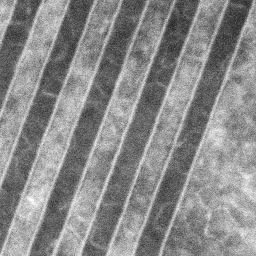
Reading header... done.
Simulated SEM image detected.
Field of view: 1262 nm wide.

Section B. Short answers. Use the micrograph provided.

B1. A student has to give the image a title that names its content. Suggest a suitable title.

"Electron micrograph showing parallel lines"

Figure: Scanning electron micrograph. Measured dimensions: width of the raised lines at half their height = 128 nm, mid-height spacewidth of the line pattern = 23.3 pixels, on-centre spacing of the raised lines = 244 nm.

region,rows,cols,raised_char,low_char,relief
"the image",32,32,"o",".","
..ooo...oooo...ooo....ooo...oooo
.oooo...ooo....ooo...oooo...ooo.
.ooo....ooo...oooo...ooo....ooo.
.ooo...oooo...ooo...oooo...oooo.
oooo...ooo...oooo...oooo...ooo..
ooo....ooo...oooo...ooo...oooo..
ooo...oooo...ooo...oooo...oooo..
ooo...ooo...oooo...ooo....ooo...
oo...oooo...ooo....ooo...oooo...
oo...oooo...ooo...oooo...ooo....
oo...ooo...oooo...ooo....ooo....
o...oooo...ooo....ooo...oooo....
o...ooo...oooo...oooo...ooo.....
....ooo...oooo...ooo...oooo.....
...oooo...ooo...oooo...ooo......
...ooo...oooo...oooo...ooo......
..oooo...oooo...ooo...oooo......
..ooo....ooo...oooo...ooo.......
..ooo...oooo...ooo....ooo.......
.oooo...ooo....ooo...oooo.......
.ooo....ooo...oooo...ooo........
.ooo...oooo...ooo...oooo........
oooo...ooo...oooo...oooo........
ooo...oooo...oooo...ooo.........
ooo...ooo....ooo...oooo.........
ooo...ooo...oooo...ooo..........
oo...oooo...oooo...ooo..........
oo...ooo....ooo...oooo..........
o....ooo...oooo...ooo...........
o...oooo...ooo...oooo...........
o...ooo...oooo...ooo............
....ooo...oooo...ooo............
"